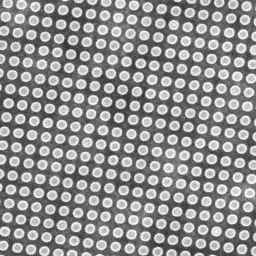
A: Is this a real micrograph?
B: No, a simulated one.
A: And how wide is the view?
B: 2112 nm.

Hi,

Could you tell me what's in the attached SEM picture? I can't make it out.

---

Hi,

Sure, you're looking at a regular array of raised bodies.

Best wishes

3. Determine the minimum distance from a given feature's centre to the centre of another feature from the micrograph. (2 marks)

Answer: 113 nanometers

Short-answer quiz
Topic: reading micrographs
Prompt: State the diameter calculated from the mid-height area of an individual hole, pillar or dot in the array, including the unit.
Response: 75.6 nanometres